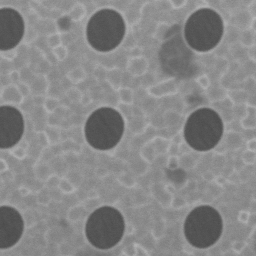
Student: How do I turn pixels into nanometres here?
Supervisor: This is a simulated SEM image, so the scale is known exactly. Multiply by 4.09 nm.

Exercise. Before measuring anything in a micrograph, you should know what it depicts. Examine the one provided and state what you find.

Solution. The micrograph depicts holes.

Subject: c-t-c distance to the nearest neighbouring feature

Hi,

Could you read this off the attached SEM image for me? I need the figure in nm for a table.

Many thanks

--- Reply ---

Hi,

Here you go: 401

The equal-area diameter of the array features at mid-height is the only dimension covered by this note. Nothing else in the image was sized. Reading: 0.17 micrometres